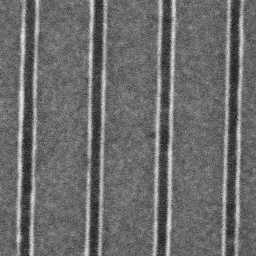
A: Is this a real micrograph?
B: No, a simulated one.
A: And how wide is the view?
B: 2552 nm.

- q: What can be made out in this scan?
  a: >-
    one or a few lines or trenches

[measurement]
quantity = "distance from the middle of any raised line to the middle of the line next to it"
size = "682 nanometres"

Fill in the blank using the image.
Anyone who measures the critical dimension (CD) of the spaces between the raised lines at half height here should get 0.547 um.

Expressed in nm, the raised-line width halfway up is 136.